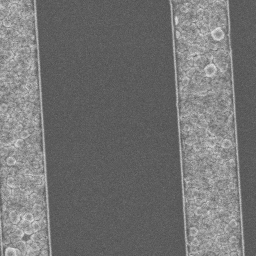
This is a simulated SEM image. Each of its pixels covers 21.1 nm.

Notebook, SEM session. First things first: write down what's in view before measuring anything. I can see one or a few lines or trenches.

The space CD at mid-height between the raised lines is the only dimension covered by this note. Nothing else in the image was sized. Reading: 1.19 µm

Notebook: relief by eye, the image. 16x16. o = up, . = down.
..ooooooooo...oo
..ooooooooo...oo
..ooooooooo...oo
..ooooooooo...oo
..ooooooooo...oo
..ooooooooo....o
...oooooooo....o
...oooooooo....o
...oooooooo....o
...oooooooo....o
...oooooooo....o
...oooooooo....o
...oooooooo....o
...ooooooooo...o
...ooooooooo...o
...ooooooooo...o